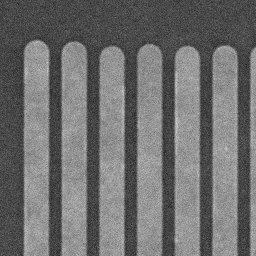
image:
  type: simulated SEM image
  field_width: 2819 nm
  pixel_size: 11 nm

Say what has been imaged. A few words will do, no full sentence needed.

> groups of lines, slits or small figures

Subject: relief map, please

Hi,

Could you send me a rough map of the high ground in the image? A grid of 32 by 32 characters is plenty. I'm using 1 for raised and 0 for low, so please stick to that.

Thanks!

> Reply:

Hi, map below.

00000000000000000000000000000000
00000000000000000000000000000000
00000000000000000000000000000000
00000000000000000000000000000000
00000000000000000000000000000000
00001100010000000000000000000000
00011100111001100111001110011000
00011100111001100111001110011101
00011100111001100111001110011101
00011100111001100111001110011101
00011100111001100111001110011001
00011100111001100111001110011001
00011100111001100111001110011001
00011100111001100111001110011001
00011100111001100111001110011001
00011100111001100111001110011101
00011100111001100111001110011101
00011100111001100111001110011101
00011100111001100111001110011101
00011100111001100111001110011101
00011100111001100111001110011101
00011100111001100111001110011001
00011100111001100111001110011001
00011100111001100111001110011001
00011100111001100111001110011001
00011100111001100111001110011101
00011100111001100111001110011101
00011100111001100111001110011101
00011100111001100111001110011101
00011100111001100111001110011101
00011100111001100111001110011101
00011100111001100111001110011101